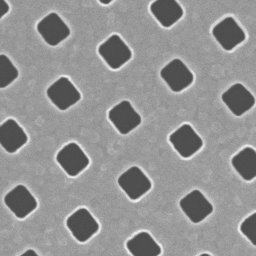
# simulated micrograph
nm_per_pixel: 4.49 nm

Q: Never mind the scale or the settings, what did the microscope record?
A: a regular array of holes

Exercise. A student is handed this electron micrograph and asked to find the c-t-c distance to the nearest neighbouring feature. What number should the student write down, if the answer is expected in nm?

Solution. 296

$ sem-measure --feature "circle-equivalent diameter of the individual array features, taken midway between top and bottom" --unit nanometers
130